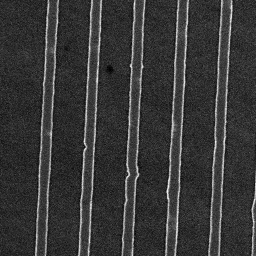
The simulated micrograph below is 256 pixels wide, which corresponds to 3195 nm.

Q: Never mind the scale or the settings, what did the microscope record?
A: parallel lines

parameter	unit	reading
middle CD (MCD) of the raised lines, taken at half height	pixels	10.4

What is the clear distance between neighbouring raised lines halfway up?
407 nm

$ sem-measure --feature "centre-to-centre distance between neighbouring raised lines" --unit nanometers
541